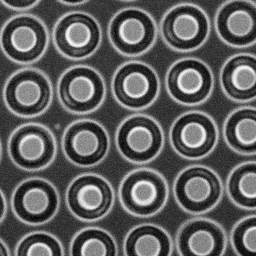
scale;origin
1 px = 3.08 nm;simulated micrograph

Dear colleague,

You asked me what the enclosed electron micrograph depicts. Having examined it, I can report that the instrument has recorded an array of small figures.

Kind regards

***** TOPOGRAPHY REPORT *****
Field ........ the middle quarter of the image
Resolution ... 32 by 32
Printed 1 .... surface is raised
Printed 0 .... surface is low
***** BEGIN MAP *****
11111111111111100000111111100000
10000001111111000000001111100001
00000000111110000110000111000111
00011000011110001111000111000111
00111110001100011111100111000111
01111110001100011111100011000111
01111110001100011111100111000011
00111110001110001111000111100000
00111100001110000000000111110000
00000000011111000000001111111000
00000000111111110000111111111111
10000001111111111111111111111111
11111111111111111111111111111110
11111111111111111000011111111000
11110001111111100000000111110000
11000000011111000000000111100001
10000000001111000111100011100011
00011110001110001111110011100011
00011111000110001111110001100011
00111111000110001111110001100011
00011111000111001111100011110001
00011111000111000111000011110000
10001110001111100000000111111000
10000000011111110000001111111111
11100000111111111100111111111111
11111111111111111111111111111111
11111111111111111110011111111100
11111111111111111000000111111000
11110000011111100000000011111000
11100000001111100001000001110001
11000000000111000011110001110011
10000111100011000111110000110011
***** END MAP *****